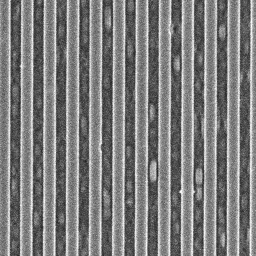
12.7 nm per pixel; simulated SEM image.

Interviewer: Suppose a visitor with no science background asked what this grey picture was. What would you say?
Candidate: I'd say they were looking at parallel lines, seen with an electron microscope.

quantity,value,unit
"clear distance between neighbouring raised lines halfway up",146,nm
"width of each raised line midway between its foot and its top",146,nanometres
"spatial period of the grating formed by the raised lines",292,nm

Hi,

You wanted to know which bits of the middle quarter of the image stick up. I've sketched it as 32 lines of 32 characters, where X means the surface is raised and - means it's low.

-XX----XX----XX---XXX---XX--X-XX
-XX----XX----XX---XXX---XXX---XX
-XX----XX----XX---XXX---XXX---XX
-XX----XX---XXX---XXX---XXX---XX
-XXX---XX---XXX---XXX---XXX---XX
-XXX---XX---XXX---XXX---XXX---XX
-XX----XX---XXX---XXX---XXX---XX
-XX----XX----XX---XXX---XXX---XX
-XXX---XX----XX---XXX---XX----XX
-XX----XX---XXX---XXX---XX----XX
-XX----XX---XXX---XXX---XXX---XX
-XX----XX---XXX---XXX---XX----XX
-XXX---XX---XXX---XXX---XX----XX
-XXX---XX---XXX---XXX---XX---XXX
-XX----XX---XXX---XXX---XX---XXX
-XX----XX---XXX---XXX---XX---XXX
-XX----XX---XXX---XXX---XX---XXX
-XX----XX---XXX---XXX---XX---XXX
-XX----XX---XXX---XXX---XX---XXX
-XX----XX---XXX---XXX---XX---XXX
-XX---XXX---XXX---XXX---XX---XXX
-XX---XXX---XXX---XXX---XX---XXX
-XX---XXX---XXX---XXX---XX---XXX
-XX---XXX---XXX---XXX---XX---XXX
-XX---XXX---XXX---XXX---XX---XXX
-XX---XXX---XXX---XXX-XXXX---XXX
-XX---XXX---XXX---XXX-XXXX---XXX
-XX---XXX---XXX---XXX-X-XX---XXX
-XX---XXX---XXX---XXX-X-XX---XXX
-XX---XXX---XXX---XXX---XX---XXX
-XX---XXX---XXX---XXX---XX---XXX
-XX---XXX---XXX---XXX---XX---XXX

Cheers